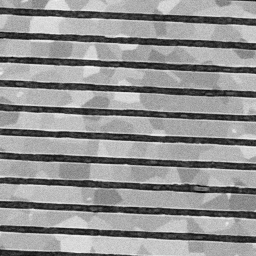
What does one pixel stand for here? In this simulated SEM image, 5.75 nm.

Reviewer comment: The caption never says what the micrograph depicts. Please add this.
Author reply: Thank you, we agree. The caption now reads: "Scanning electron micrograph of parallel lines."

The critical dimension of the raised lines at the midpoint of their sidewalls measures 17 pixels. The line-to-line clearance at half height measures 40.2 nanometers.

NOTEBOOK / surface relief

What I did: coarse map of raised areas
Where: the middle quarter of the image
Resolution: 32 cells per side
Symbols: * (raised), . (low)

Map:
................................
***********************.........
********************************
********************************
********************************
......................**********
................................
***********************.........
********************************
********************************
********************************
......................**********
................................
***********************.........
********************************
********************************
********************************
..................**************
................................
*******************.............
********************************
********************************
.*******************************
...................*************
.....................**.........
******************.*............
********************************
********************************
********************************
...................*************
................................
****************................